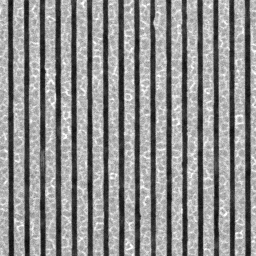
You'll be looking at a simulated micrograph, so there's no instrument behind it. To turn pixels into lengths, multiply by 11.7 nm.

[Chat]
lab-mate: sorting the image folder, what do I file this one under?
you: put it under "parallel lines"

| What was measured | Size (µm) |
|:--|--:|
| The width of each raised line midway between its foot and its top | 0.115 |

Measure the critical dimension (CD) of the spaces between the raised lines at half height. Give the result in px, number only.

5.5